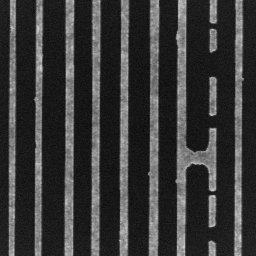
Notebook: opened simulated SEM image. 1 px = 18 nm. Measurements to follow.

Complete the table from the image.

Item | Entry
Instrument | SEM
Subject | parallel lines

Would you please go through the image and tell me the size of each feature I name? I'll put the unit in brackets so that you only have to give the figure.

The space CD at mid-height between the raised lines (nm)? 382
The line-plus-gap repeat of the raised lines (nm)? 508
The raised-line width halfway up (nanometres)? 128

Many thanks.